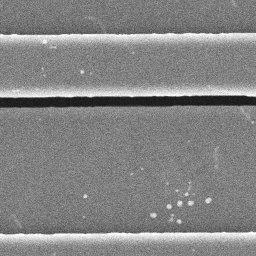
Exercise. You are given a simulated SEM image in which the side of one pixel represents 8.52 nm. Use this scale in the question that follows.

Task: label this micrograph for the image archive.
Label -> lines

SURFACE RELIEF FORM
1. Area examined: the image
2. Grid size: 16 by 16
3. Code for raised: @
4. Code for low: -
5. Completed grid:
----------------
----------------
@@@@@@@@@@@@@@@@
@@@@@@@@@@@@@@@@
@@@@@@@@@@@@@@@@
@@@@@@@@@@@@@@@@
----------------
----------------
----------------
----------------
----------------
----------------
----------------
----------------
----------------
@@@@@@@@@@@@@@@@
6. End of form